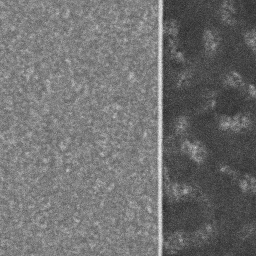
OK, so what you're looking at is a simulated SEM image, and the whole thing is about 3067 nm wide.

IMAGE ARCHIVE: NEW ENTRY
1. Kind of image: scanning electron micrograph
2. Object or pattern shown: one or a few lines or trenches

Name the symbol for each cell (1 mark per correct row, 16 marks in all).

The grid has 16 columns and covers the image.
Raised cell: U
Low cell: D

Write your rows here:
UUUUUUUUUUDDDDDD
UUUUUUUUUUDDDDDD
UUUUUUUUUUDDDDDD
UUUUUUUUUUDDDDDD
UUUUUUUUUUDDDDDD
UUUUUUUUUUDDDDDD
UUUUUUUUUUDDDDDD
UUUUUUUUUUDDDDDD
UUUUUUUUUUDDDDDD
UUUUUUUUUUDDDDDD
UUUUUUUUUUDDDDDD
UUUUUUUUUUDDDDDD
UUUUUUUUUUDDDDDD
UUUUUUUUUUDDDDDD
UUUUUUUUUUDDDDDD
UUUUUUUUUUDDDDDD